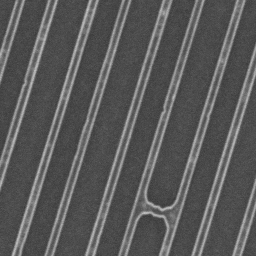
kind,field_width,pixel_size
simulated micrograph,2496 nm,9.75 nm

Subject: parallel lines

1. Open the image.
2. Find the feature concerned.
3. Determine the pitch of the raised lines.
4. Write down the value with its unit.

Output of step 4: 342 nm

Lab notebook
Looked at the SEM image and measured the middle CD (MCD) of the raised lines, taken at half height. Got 72.3 nm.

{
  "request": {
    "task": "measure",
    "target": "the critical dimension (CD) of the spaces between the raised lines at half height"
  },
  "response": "245 nm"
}